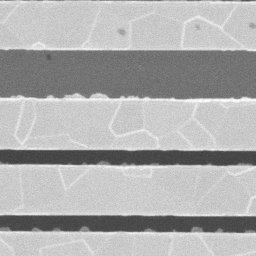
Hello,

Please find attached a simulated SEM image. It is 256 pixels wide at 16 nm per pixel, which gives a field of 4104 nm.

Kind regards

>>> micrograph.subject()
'lines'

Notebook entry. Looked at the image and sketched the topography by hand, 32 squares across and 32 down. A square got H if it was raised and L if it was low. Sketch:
HHHHHHHHHHHHHHHHHHHHHHHHHHHHHHHH
HHHHHHHHHHHHHHHHHHHHHHHHHHHHHHHH
HHHHHHHHHHHHHHHHHHHHHHHHHHHHHHHH
HHHHHHHHHHHHHHHHHHHHHHHHHHHHHHHH
HHHHHHHHHHHHHHHHHHHHHHHHHHHHHHHH
HHHHHHHHHHHHHHHHHHHHHHHHHHHHHHHH
LLLLLLLLLLLLLLLLLLLLLLLLLLLLLLLL
LLLLLLLLLLLLLLLLLLLLLLLLLLLLLLLL
LLLLLLLLLLLLLLLLLLLLLLLLLLLLLLLL
LLLLLLLLLLLLLLLLLLLLLLLLLLLLLLLL
LLLLLLLLLLLLLLLLLLLLLLLLLLLLLLLL
LLLLLLLLLLLLLLLLLLLLLLLLLLLLLLLL
HHHHHHHHHHHHHHHHHHHHHHLLLLLLLLLL
HHHHHHHHHHHHHHHHHHHHHHHHHHHHHHHH
HHHHHHHHHHHHHHHHHHHHHHHHHHHHHHHH
HHHHHHHHHHHHHHHHHHHHHHHHHHHHHHHH
HHHHHHHHHHHHHHHHHHHHHHHHHHHHHHHH
HHHHHHHHHHHHHHHHHHHHHHHHHHHHHHHH
HHHHHHHHHHHHHHHHHHHHHHHHHHHHHHHH
LLLLLLLLLLLLLLLLLLLLLLLLLLLLLLLL
LLLLLLLLLLLLLLLLLLLLLLLLLLLLLLLL
HHHHHHHHHHHHHHHHHHHHHHHHHHHHHHHH
HHHHHHHHHHHHHHHHHHHHHHHHHHHHHHHH
HHHHHHHHHHHHHHHHHHHHHHHHHHHHHHHH
HHHHHHHHHHHHHHHHHHHHHHHHHHHHHHHH
HHHHHHHHHHHHHHHHHHHHHHHHHHHHHHHH
HHHHHHHHHHHHHHHHHHHHHHHHHHHHHHHH
LLLLLLLLLLLLLLLLLLLLLLLLLLLLLLLL
LLLLLLLLLLLLLLLLLLLLLLLLLLLLLLLL
HHHHHHHHHHHHHHHHHHHHHHHHHHHHHHHH
HHHHHHHHHHHHHHHHHHHHHHHHHHHHHHHH
HHHHHHHHHHHHHHHHHHHHHHHHHHHHHHHH